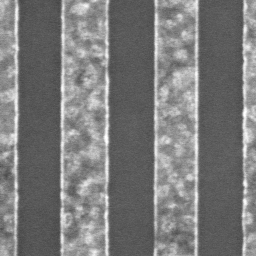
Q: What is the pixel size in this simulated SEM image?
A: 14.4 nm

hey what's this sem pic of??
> one or a few lines or trenches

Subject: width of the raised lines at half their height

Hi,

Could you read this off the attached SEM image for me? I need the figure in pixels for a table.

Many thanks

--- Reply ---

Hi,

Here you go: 42.9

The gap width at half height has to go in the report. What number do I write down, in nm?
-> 681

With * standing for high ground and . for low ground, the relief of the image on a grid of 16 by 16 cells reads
*...***...**...*
*...***...**...*
*...***...**...*
*...***...**...*
*...***...**...*
*...***...**...*
*...***...**...*
*...***...**...*
*...***...**...*
*...***...**...*
*...***...**...*
*...***...**...*
*...***...**...*
*...***...**...*
*...***...**...*
*...***...**...*